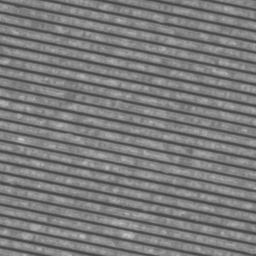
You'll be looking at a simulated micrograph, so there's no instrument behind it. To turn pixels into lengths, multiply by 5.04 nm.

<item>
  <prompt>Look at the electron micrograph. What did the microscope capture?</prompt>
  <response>parallel lines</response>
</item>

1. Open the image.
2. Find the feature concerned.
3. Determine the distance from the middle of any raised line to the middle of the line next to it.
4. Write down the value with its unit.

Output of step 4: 10.5 pixels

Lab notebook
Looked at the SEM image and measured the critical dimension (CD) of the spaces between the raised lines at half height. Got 0.0173 um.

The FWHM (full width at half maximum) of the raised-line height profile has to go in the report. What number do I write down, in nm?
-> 34.6